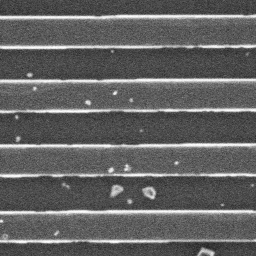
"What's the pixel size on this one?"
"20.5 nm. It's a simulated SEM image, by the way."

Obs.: lines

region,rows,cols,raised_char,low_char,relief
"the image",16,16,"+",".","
................
++++++++++++++++
++++++++++++++++
................
................
++++++++++++++++
++++++++++++++++
................
................
++++++++++++++++
++++++++++++++++
................
................
++++++++++++++++
++++++++++++++++
................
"